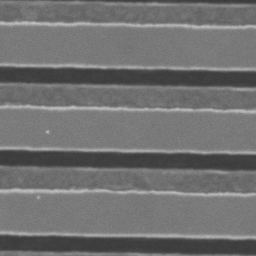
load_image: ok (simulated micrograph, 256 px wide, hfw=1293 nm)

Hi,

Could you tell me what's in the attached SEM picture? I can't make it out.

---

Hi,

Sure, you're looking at lines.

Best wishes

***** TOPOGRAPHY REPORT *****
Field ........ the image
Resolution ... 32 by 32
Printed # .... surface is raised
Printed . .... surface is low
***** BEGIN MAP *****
###########################.....
################################
################################
################################
################################
################################
################################
################################
............####################
................................
#####...........................
################################
################################
################################
################################
################################
################################
################################
################################
................................
................................
################################
################################
################################
################################
################################
################################
################################
################################
.........#######################
................................
####............................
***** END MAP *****